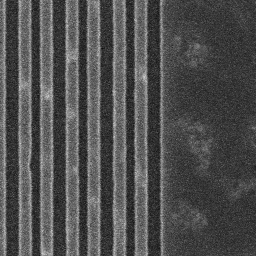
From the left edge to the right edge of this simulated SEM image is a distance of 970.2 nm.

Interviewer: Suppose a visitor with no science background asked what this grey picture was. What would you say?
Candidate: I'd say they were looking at parallel lines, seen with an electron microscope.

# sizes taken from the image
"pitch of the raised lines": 88.2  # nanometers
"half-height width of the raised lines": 45.5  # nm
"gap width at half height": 51.7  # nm